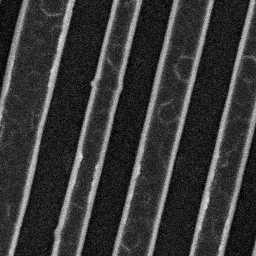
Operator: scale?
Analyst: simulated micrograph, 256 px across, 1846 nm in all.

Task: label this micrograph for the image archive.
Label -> one or a few lines or trenches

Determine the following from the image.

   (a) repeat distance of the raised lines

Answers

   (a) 497 nm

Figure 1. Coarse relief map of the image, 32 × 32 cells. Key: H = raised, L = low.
LLLHHHHHHLLLLLHHHLLLLLHHHHLLLLLH
LLLHHHHHHLLLLLHHHLLLLLHHHHLLLLLH
LLLHHHHHHLLLLLHHHLLLLHHHHHLLLLLH
LLHHHHHHLLLLLLHHHLLLLHHHHHLLLLLH
LLHHHHHHLLLLLHHHLLLLLHHHHLLLLLLH
LLHHHHHHLLLLLHHHLLLLLHHHHLLLLLHH
LLHHHHHHLLLLLHHHLLLLHHHHHLLLLLHH
LHHHHHHLLLLLLHHHLLLLHHHHHLLLLLHH
LHHHHHHLLLLLHHHLLLLLHHHHLLLLLHHH
LHHHHHHLLLLLHHHLLLLLHHHHLLLLLHHH
LHHHHHLLLLLLHHHLLLLHHHHHLLLLLHHH
HHHHHHLLLLLLHHHLLLLHHHHHLLLLLHHH
HHHHHHLLLLLHHHLLLLLHHHHLLLLLLHHH
HHHHHHLLLLLHHHLLLLLHHHHLLLLLHHHH
HHHHHHLLLLLHHHLLLLLHHHHLLLLLHHHH
HHHHHLLLLLLHHHLLLLHHHHHLLLLLHHHH
HHHHHLLLLLHHHHLLLLHHHHLLLLLLHHHL
HHHHHLLLLLHHHLLLLLHHHHLLLLLHHHHL
HHHHHLLLLLHHHLLLLLHHHHLLLLLHHHHL
HHHHLLLLLLHHHLLLLHHHHHLLLLLHHHHL
HHHHLLLLLLHHHLLLLHHHHHLLLLLHHHLL
HHHHLLLLLHHHLLLLLHHHHLLLLLHHHHLL
HHHHLLLLLHHHLLLLLHHHHLLLLLHHHHLL
HHHHLLLLLHHHLLLLHHHHHLLLLLHHHHLL
HHHLLLLLLHHHLLLLHHHHHLLLLLHHHLLL
HHHLLLLLHHHLLLLLHHHHLLLLLHHHHLLL
HHHLLLLLHHHLLLLLHHHHLLLLLHHHHLLL
HHHLLLLLHHHLLLLHHHHHLLLLLHHHHLLL
HHLLLLLHHHHLLLLHHHHHLLLLLHHHHLLL
HHLLLLLHHHLLLLLHHHHLLLLLHHHHLLLL
HHLLLLLHHHLLLLLHHHHLLLLLHHHHLLLL
HHLLLLLHHHLLLLHHHHHLLLLLHHHHLLLL